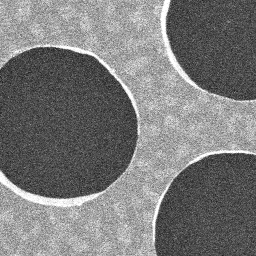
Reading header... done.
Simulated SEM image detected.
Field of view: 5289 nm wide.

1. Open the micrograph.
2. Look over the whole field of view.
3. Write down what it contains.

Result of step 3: holes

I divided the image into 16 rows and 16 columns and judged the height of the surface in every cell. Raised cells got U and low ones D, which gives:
UUUUUUUUUUUDDDDD
UUUUUUUUUUDDDDDD
UUUUUUUUUUDDDDDD
UDDDDDUUUUUDDDDD
DDDDDDDUUUUDDDDD
DDDDDDDDUUUUDDDD
DDDDDDDDUUUUUUUU
DDDDDDDDDUUUUUUU
DDDDDDDDDUUUUUUU
DDDDDDDDUUUUUUUU
DDDDDDDDUUUUDDDD
UDDDDDDUUUUDDDDD
UUDDDUUUUUDDDDDD
UUUUUUUUUUDDDDDD
UUUUUUUUUUDDDDDD
UUUUUUUUUUDDDDDD